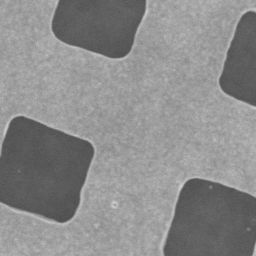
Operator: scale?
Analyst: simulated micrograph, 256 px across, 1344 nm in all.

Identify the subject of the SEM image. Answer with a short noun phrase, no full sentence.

holes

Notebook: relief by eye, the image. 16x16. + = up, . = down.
++++.....+++++++
+++......++++++.
++++....+++++++.
+++++++.++++++..
++++++++++++++..
++++++++++++++..
+++++++++++++++.
+.++++++++++++++
.....+++++++++++
......++++++++++
......++++++++++
.....+++++++..++
.....++++++.....
++...++++++.....
+++++++++++.....
++++++++++......